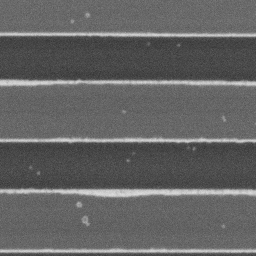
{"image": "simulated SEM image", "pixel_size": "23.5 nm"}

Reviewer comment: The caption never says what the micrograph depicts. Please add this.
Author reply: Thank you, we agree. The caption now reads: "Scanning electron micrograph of lines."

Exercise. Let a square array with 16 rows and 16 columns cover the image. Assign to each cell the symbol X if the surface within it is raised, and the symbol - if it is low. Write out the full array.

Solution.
XXXXXXXXXXXXXXXX
XXXXXXXXXXXXXXXX
----------------
----------------
----------------
XXXXXXXXXXXXXXXX
XXXXXXXXXXXXXXXX
XXXXXXXXXXXXXXXX
XXXXXXXXXXXXXXXX
----------------
----------------
----------------
XXXXXXXXXXXXXXXX
XXXXXXXXXXXXXXXX
XXXXXXXXXXXXXXXX
XXXXXXXXXXXXXXXX